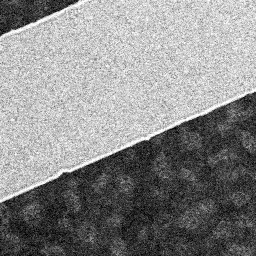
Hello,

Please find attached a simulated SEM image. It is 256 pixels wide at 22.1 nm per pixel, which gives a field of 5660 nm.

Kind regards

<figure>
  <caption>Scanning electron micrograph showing one or a few lines or trenches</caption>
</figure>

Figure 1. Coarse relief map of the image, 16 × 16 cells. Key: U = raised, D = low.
DDDDUUUUUUUUUUUU
DDUUUUUUUUUUUUUU
UUUUUUUUUUUUUUUU
UUUUUUUUUUUUUUUU
UUUUUUUUUUUUUUUU
UUUUUUUUUUUUUUUU
UUUUUUUUUUUUUUDD
UUUUUUUUUUUUDDDD
UUUUUUUUUDDDDDDD
UUUUUUUDDDDDDDDD
UUUUUDDDDDDDDDDD
UUDDDDDDDDDDDDDD
DDDDDDDDDDDDDDDD
DDDDDDDDDDDDDDDD
DDDDDDDDDDDDDDDD
DDDDDDDDDDDDDDDD